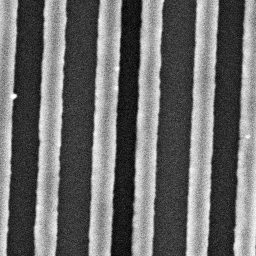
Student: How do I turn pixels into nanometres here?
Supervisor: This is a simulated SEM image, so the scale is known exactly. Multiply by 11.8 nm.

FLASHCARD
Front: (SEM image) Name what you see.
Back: lines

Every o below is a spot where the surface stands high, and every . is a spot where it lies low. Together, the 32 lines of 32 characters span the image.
oo....oo....ooo...oo.....oo....o
oo....oo....ooo...oo.....oo....o
oo....oo....ooo...oo.....oo...oo
oo....oo....ooo...oo.....oo...oo
oo....oo....ooo...oo.....oo...oo
oo....oo....ooo...oo.....oo...oo
oo...ooo....ooo...oo....ooo...oo
oo...ooo....ooo...oo....ooo...oo
oo...ooo....ooo..ooo....ooo...oo
oo...ooo....ooo..ooo....ooo...oo
oo...ooo....ooo..ooo....ooo...oo
oo...ooo....ooo..ooo....ooo...oo
oo...ooo....ooo..ooo....ooo...oo
oo...ooo....ooo..ooo....ooo...oo
o....ooo....ooo..ooo....ooo...oo
o....ooo....oo...ooo....ooo...oo
o....ooo....oo...ooo....ooo...oo
o....ooo....oo...ooo....ooo...oo
o....ooo....oo...oo.....ooo...oo
o....oo.....oo...oo.....ooo...oo
o....oo.....oo...oo.....oo....oo
o....oo....ooo...oo.....oo....oo
o....oo....ooo...oo.....oo....oo
o....oo....ooo...oo.....oo....oo
o....oo....ooo...oo.....oo....oo
o....oo....ooo...oo.....oo....oo
o....oo....ooo...oo.....oo....oo
o...ooo....ooo...oo.....oo....oo
o...ooo....ooo...oo....ooo...ooo
o...ooo....ooo...oo....ooo...ooo
o...ooo....ooo...oo....ooo...ooo
o...ooo....ooo...oo....ooo...ooo